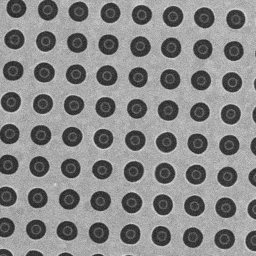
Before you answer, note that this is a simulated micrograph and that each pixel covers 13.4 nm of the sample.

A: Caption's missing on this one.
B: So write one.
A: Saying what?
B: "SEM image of an array of small figures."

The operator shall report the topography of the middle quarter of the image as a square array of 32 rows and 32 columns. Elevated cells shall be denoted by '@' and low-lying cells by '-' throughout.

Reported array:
@@---@@@@@--@@@@@@@@@@@@@@@@@@@@
@----@@@-----@@@@---@@@@@---@@@@
------@@-----@@@-----@@@-----@@@
-----@@@-----@@@-----@@@-----@@@
@----@@@@----@@@-----@@@-----@@@
@@@@@@@@@@--@@@@@---@@@@@----@@@
@@@@@@@@@@@@@@@@@@@@@@@@@@@@@@@@
@@@@@@@@@@@@@@@@@@@@@@@@@@@@@@@@
----@@@@@---@@@@@@@@@@@@@@@@@@@@
-----@@@-----@@@----@@@@----@@@@
-----@@@-----@@@-----@@@-----@@@
-----@@@-----@@@-----@@------@@@
@---@@@@----@@@@----@@@@-----@@-
@@@@@@@@@@-@@@@@@--@@@@@----@@@@
@@@@@@@@@@@@@@@@@@@@@@@@@@@@@@@@
@@@@@@@@@@@@@@@@@@@@@@@@@@@@@@@@
----@@@@---@@@@@@-@@@@@@@@@@@@@@
-----@@-----@@@@----@@@@---@@@@@
-----@@------@@-----@@@-----@@@-
----@@@-----@@@------@@-----@@@-
@--@@@@@----@@@@----@@@-----@@@-
@@@@@@@@@@@@@@@@@--@@@@@----@@@-
@@@@@@@@@@@@@@@@@@@@@@@@@@@@@@@@
@@@@@@@@@@@@@@@@@@@@@@@@@@@@@@@@
----@@@@---@@@@@---@@@@@--@@@@@@
----@@@-----@@@-----@@@----@@@@-
----@@@-----@@@-----@@------@@@-
----@@@-----@@@-----@@------@@--
@--@@@@@---@@@@-----@@@-----@@--
@@@@@@@@@@@@@@@@--@@@@@----@@@@-
@@@@@@@@@@@@@@@@@@@@@@@@@@@@@@@@
---@@@@@@@@@@@@@@@@@@@@@@@@@@@@@